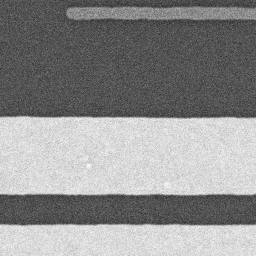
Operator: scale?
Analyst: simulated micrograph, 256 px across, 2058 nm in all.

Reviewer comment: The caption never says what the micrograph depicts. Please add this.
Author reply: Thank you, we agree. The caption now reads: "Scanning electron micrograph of wiring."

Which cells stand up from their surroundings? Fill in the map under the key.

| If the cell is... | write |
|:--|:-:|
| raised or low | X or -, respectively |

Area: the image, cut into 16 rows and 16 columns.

----------------
----------------
----------------
----------------
----------------
----------------
----------------
XXXXXXXXXXXXXXXX
XXXXXXXXXXXXXXXX
XXXXXXXXXXXXXXXX
XXXXXXXXXXXXXXXX
XXXXXXXXXXXXXXXX
----------------
----------------
XXXXXXXXXXXXXXXX
XXXXXXXXXXXXXXXX